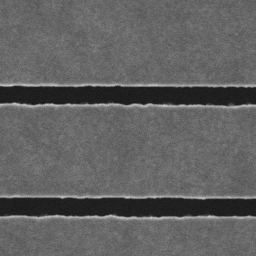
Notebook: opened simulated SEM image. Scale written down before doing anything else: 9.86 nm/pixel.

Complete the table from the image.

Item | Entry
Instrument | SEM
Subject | lines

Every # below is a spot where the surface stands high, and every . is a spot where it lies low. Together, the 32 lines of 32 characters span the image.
################################
################################
################################
################################
################################
################################
################################
################################
################################
################################
################################
................................
................................
################################
################################
################################
################################
################################
################################
################################
################################
################################
################################
################################
################################
................................
................................
################################
################################
################################
################################
################################